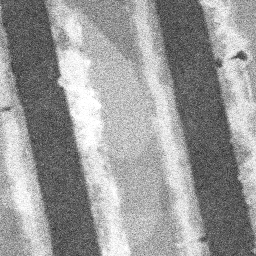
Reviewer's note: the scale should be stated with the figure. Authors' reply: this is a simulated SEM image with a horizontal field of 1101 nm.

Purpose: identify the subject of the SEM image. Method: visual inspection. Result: one or a few lines or trenches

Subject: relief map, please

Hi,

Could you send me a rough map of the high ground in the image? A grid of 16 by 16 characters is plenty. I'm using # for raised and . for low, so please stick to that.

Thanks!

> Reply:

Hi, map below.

....#####.....##
....#####.....##
.....####......#
....#####......#
.....#####....##
.....#####.....#
.....#####.....#
#....#####.....#
#.....####.....#
#.....#####.....
#.....#####.....
#.....#####.....
#......####.....
##.....#####....
##.....#####....
###....#####....